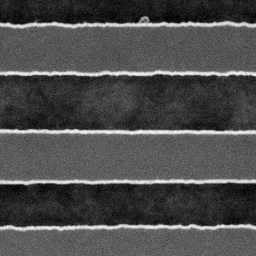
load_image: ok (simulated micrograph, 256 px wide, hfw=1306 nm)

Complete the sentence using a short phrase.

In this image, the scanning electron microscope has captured lines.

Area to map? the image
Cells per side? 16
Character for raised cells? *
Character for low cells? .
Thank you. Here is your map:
................
..**....*******.
****************
****************
****************
................
................
................
****************
****************
****************
................
................
................
****************
****************